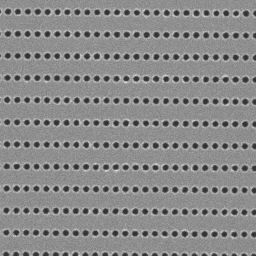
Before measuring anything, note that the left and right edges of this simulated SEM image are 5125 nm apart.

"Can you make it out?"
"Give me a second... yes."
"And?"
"a regular array of holes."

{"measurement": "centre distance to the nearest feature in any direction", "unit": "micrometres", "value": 0.197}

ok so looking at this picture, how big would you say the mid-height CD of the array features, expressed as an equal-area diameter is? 0.128 µm